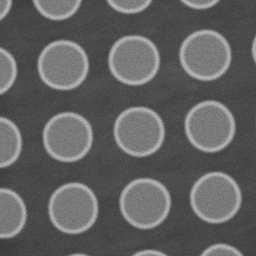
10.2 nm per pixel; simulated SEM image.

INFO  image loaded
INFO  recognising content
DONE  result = an array of small figures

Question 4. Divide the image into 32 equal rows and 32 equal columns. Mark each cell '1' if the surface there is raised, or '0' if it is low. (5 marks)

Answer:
10001111110000111110000111100000
10000111100000011000000000000000
00000000000000000000000000000000
00000000000000000000000000000000
00000000000000000000000011110000
00000011110000111110000111111000
10000111111000111111001111111000
11000111111000111111000111111000
11000111111000111111000111110000
11000111111000111110000011110000
10000011110000001100000000000000
10000000000000000000000000000000
00000000000000000000000000000000
00000000000000001100000011110000
00000001110000011111000111111000
11000011111000111111000111111000
11000111111000111111100111111000
11100111111100111111000011111000
11100011111000011111000001110000
11000011110000000100000000000000
10000000000000000000000000000000
00000000000000000000000000000000
00000000000000000110000001111000
00000001111000001111100011111100
11000011111100011111100011111100
11100011111100011111100011111100
11100011111100011111100011111100
11100011111100001111000000110000
11100001111000000110000000000000
11000000000000000000000000000000
00000000000000000000000000000000
00000000000000000111000001111100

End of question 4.